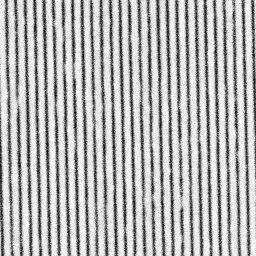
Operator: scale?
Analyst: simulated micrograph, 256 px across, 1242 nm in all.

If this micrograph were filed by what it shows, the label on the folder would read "parallel lines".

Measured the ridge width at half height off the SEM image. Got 0.0315 micrometres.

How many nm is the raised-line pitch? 45.9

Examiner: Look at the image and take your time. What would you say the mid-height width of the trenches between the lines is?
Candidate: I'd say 13.3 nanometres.